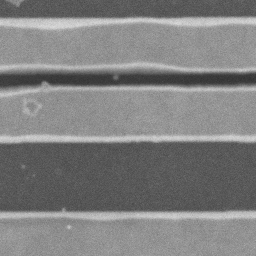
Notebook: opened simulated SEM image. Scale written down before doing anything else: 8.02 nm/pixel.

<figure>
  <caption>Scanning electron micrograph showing lines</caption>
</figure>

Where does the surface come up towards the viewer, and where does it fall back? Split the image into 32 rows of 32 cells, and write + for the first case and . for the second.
................................
................................
..............+++++++.......++++
++++++++++++++++++++++++++++++++
++++++++++++++++++++++++++++++++
++++++++++++++++++++++++++++++++
++++++++++++++++++++++++++++++++
++++++++++++++++++++++++++++++++
++++++++++++++++++++++++++++++++
................................
.....+..........................
++++++++++++++++++++++++++++++++
++++++++++++++++++++++++++++++++
++++++++++++++++++++++++++++++++
++++++++++++++++++++++++++++++++
++++++++++++++++++++++++++++++++
++++++++++++++++++++++++++++++++
.++.............................
................................
................................
................................
................................
................................
................................
................................
................................
................................
++++++++++++++++++++++++++++++++
++++++++++++++++++++++++++++++++
++++++++++++++++++++++++++++++++
++++++++++++++++++++++++++++++++
++++++++++++++++++++++++++++++++